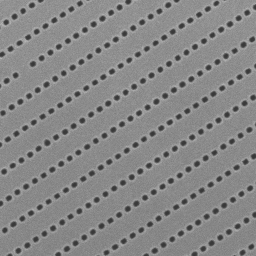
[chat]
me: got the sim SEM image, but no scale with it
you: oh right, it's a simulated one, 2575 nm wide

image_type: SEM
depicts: a regular array of holes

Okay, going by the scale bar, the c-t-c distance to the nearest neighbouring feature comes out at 102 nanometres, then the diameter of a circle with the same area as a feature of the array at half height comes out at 60.1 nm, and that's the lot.